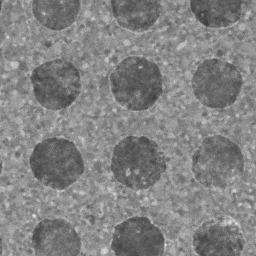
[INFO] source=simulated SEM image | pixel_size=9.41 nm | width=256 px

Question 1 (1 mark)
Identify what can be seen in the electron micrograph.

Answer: holes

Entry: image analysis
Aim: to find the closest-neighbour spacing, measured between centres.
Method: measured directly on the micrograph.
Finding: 744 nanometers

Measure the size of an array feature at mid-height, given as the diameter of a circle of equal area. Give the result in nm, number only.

510